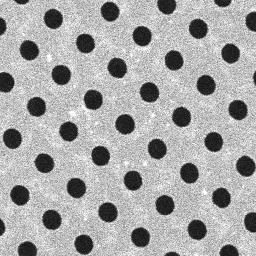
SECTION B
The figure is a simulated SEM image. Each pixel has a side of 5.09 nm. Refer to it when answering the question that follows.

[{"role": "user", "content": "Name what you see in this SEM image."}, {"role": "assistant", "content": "a regular array of holes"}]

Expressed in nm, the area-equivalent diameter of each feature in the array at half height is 102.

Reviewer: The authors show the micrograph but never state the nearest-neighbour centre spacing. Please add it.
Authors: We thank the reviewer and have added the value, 40 pixels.